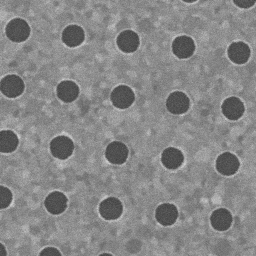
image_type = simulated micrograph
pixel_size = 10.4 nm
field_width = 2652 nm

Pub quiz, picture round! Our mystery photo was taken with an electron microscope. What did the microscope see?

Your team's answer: a regular array of holes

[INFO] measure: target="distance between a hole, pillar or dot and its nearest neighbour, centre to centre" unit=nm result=572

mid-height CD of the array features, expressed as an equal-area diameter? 0.248 um